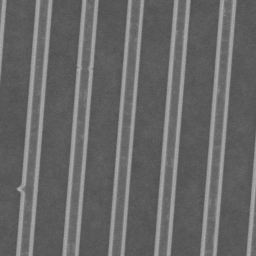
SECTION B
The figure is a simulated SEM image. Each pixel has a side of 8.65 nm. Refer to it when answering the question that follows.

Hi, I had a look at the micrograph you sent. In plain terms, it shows parallel lines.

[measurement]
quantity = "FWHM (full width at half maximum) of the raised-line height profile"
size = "108 nm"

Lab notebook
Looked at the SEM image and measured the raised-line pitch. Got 397 nm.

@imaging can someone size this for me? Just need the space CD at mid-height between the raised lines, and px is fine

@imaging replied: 33.6